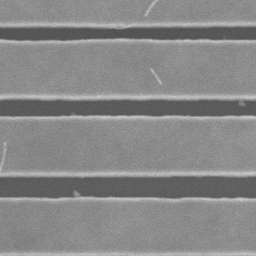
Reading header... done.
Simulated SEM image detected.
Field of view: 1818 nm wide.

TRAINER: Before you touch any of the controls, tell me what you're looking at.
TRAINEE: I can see lines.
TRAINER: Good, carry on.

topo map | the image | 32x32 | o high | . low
oooooooooooooooooooooooooooooooo
oooooooooooooooooooooooooooooooo
oooooooooooooooooooooooooooooooo
..............oo................
................................
oooooooooooooooooooooooooooooooo
oooooooooooooooooooooooooooooooo
oooooooooooooooooooooooooooooooo
oooooooooooooooooooooooooooooooo
oooooooooooooooooooooooooooooooo
oooooooooooooooooooooooooooooooo
oooooooooooooooooooooooooooooooo
........oooo....................
................................
................................
oooooooooooooooooooooooooooooooo
oooooooooooooooooooooooooooooooo
oooooooooooooooooooooooooooooooo
oooooooooooooooooooooooooooooooo
oooooooooooooooooooooooooooooooo
oooooooooooooooooooooooooooooooo
oooooooooooooooooooooooooooooooo
................................
................................
................................
oooooooooooooooooooooooooooooooo
oooooooooooooooooooooooooooooooo
oooooooooooooooooooooooooooooooo
oooooooooooooooooooooooooooooooo
oooooooooooooooooooooooooooooooo
oooooooooooooooooooooooooooooooo
oooooooooooooooooooooooooooooooo